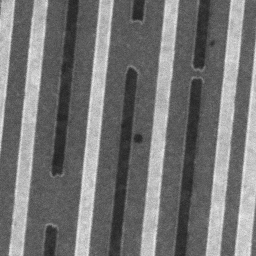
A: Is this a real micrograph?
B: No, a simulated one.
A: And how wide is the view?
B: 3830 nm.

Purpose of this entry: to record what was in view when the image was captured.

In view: parallel lines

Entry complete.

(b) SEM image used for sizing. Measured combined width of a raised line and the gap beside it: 486 nm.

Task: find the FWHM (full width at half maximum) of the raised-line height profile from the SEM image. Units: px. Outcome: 12.7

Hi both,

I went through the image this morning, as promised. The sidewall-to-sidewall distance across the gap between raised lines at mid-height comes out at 298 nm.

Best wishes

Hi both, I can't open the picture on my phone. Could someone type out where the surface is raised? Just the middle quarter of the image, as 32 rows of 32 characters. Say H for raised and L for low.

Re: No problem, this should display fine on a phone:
HHLLLLLLHHHLLLLLLLLLLLLLHHHLLLLL
HHLLLLLHHHLLLLLLHHLLLLLLHHHLLLLL
HHLLLLLHHHLLLLLLHHHLLLLLHHHLLLLL
HHLLLLLHHHLLLLLHHHLLLLLLHHHLLLLL
HHLLLLLHHHLLLLLHHHLLLLLLHHHLLLLL
HHLLLLLHHHLLLLLHHHLLLLLHHHLLLLLL
HHLLLLLHHHLLLLLHHHLLLLLHHHLLLLLH
HHLLLLLHHHLLLLLHHHLLLLLHHHLLLLLH
HHLLLLLHHHLLLLLHHHLLLLLHHHLLLLLH
HLLLLLLHHHLLLLLHHHLLLLLHHHLLLLLH
HLLLLLLHHHLLLLLHHHLLLLLHHHLLLLLH
HLLLLLHHHLLLLLLHHHLLLLLHHHLLLLLH
HLLLLLHHHLLLLLLHHHLLLLLHHHLLLLLH
HLLLLLHHHLLLLLHHHLLLLLLHHHLLLLLH
HLLLLLHHHLLLLLHHHLLLLLLHHHLLLLLH
HLLLLLHHHLLLLLHHHLLLLLHHHLLLLLLH
HLLLLLHHHLLLLLHHHLLLLLHHHLLLLLLH
HLLLLLHHHLLLLLHHHLLLLLHHHLLLLLHH
HLLLLLHHHLLLLLHHHLLLLLHHHLLLLLHH
HLLLLLHHHLLLLLHHHLLLLLHHHLLLLLHH
LLLLLLHHHLLLLLHHHLLLLLHHHLLLLLHH
LLLLLHHHLLLLLLHHHLLLLLHHHLLLLLHH
LLLLLHHHLLLLLLHHHLLLLLHHHLLLLLHH
LLLLLHHHLLLLLHHHLLLLLLHHHLLLLLHH
LLLLLHHHLLLLLHHHLLLLLLHHHLLLLLHH
LLLLLHHHLLLLLHHHLLLLLHHHLLLLLLHH
LLLLLHHHLLLLLHHHLLLLLHHHLLLLLLHH
LLLLLHHHLLLLLHHHLLLLLHHHLLLLLHHH
LLLLLHHHLLLLLHHHLLLLLHHHLLLLLHHH
LLLLLHHHLLLLLHHHLLLLLHHHLLLLLHHH
LLLLLHHHLLLLLHHHLLLLLHHHLLLLLHHH
LLLLLHHHLLLLLHHHLLLLLHHHLLLLLHHH